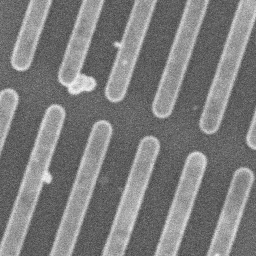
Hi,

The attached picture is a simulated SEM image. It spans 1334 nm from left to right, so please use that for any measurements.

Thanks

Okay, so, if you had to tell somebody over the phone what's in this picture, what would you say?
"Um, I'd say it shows groups of lines, slits or small figures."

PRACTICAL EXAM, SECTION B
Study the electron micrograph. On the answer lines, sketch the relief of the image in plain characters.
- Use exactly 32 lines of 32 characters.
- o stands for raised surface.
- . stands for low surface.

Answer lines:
....oo....ooo....oo....ooo....oo
...ooo....oo....ooo....ooo....oo
...ooo....oo....ooo....oo....ooo
...oo....ooo....oo....ooo....oo.
..ooo....oo.....oo....oo.....oo.
..ooo....oo....ooo....oo....ooo.
..oo....ooo....oo....ooo....oo..
..oo....oo....ooo....ooo....oo..
..o.....oo....ooo....oo....ooo..
.......ooo....oo....ooo....oo...
........o....ooo....ooo....oo...
oo...........ooo....oo....ooo...
oo............o....ooo....oo....
oo....oo...........ooo....oo....
oo....oo............o....ooo....
o....ooo....oo...........oo....o
o....oo....ooo............o....o
o....oo....ooo....oo...........o
....ooo....oo....ooo............
....oo....ooo....ooo....o.......
....oo....ooo....oo....ooo......
...ooo....oo....ooo....oo.....o.
...oo.....oo....oo.....oo....ooo
...oo....ooo....oo....ooo....oo.
..ooo....oo....ooo....oo....ooo.
..oo....ooo....ooo....oo....ooo.
..oo....ooo....oo....ooo....oo..
.ooo....oo....ooo....oo....ooo..
.oo....ooo....oo.....oo....ooo..
ooo....ooo....oo....ooo....oo...
ooo....oo....ooo....oo....ooo...
oo....ooo....ooo....oo....ooo...